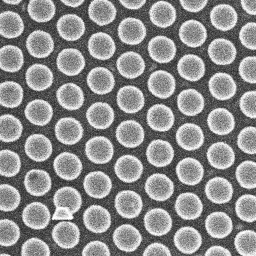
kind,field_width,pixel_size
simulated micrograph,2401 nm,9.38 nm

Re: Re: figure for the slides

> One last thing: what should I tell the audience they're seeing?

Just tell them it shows a regular array of raised bodies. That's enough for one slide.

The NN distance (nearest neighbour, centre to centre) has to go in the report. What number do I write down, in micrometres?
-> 0.32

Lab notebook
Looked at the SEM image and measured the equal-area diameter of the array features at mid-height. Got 26.7 px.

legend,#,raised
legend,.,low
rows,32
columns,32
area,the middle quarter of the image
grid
#####........#######........####
####...####...######.........###
.##...######..#####...####...###
......######....#....######...##
......######.........#######....
###...######.........#######....
####...#####..#####...#####....#
#####........#######..#####..###
#####........#######........####
#####........#######........####
####...####...######...##....###
......######...####..######..###
......######.........######...##
......######.........######.....
####..######...###...######.....
####...####...#####...#####...##
####.........#######...###...###
####.........#######........####
####...###...#######........####
###...#####...#####...####...###
......######....##...######..###
.....#######.........######.....
##....######.........######.....
###...######..####...######.....
####....###..######...#####..###
####.........#######....#...####
####.........######.........####
####..####...######....#....####
###..######...#####..#####...###
.....#######.........######...##
.....#######........#######.....
###..######..........######.....